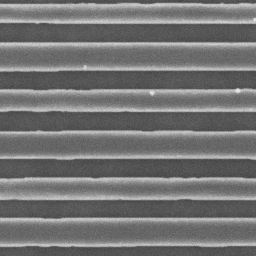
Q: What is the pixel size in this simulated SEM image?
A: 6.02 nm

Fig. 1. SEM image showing lines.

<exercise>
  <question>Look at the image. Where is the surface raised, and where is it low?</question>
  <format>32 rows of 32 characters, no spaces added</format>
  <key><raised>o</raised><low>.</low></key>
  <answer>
.....................oo.........
oooooooooooooooooooooooooooooooo
oooooooooooooooooooooooooooooooo
................................
................................
oooooooooooooooooooooooooooooooo
oooooooooooooooooooooooooooooooo
oooooooooooooooooooooooooooooooo
oooooooooooooooooooooooooooooooo
................................
................................
oooooooooooooooooooooooooooooooo
oooooooooooooooooooooooooooooooo
oooooooooooooooooooooooooooooooo
................................
................................
.............o..................
oooooooooooooooooooooooooooooooo
oooooooooooooooooooooooooooooooo
oooooooooooooooooooooooooooooooo
................................
................................
oooooooooooooooooooooooooooooooo
oooooooooooooooooooooooooooooooo
oooooooooooooooooooooooooooooooo
................................
................................
oooooooooooooooooooooooooooooooo
oooooooooooooooooooooooooooooooo
oooooooooooooooooooooooooooooooo
oooooooooooooooooooooooooooooooo
................................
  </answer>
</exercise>